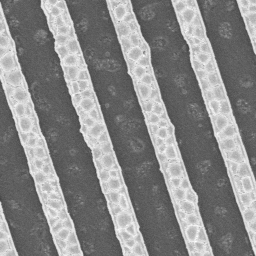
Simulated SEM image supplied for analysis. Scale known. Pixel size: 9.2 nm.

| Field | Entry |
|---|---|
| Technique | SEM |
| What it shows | one or a few lines or trenches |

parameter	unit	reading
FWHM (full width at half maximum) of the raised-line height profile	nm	203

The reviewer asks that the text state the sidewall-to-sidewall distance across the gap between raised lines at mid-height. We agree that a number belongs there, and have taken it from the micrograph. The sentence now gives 368 nm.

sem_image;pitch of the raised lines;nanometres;573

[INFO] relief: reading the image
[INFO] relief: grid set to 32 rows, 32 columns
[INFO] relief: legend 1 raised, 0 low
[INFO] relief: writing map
00000111000001110000001110000011
00000011100000111000001110000011
10000011100000111000001110000001
10000011100000111000000111000001
10000001100000011100000111000001
11000001110000011100000011000000
11000001110000011110000011100000
11000000110000001110000011100000
11000000111000001110000011100000
11100000111000001110000001110000
11100000111000000111000001110000
01110000011100000111000001110000
01110000011100000111000000111000
01110000011100000011100000111000
00111000001110000011100000111000
00111000001110000011100000011000
00111000001110000001110000011100
00011100000111000001110000011100
00011100000111000001110000011100
00011100000011000000111000001110
00001110000011100000111000001110
00001110000011100000111000000110
00001110000011100000011100000111
00000110000001110000011100000111
00000111000001110000011110000111
00000111000001110000001110000011
00000011000000111000001110000011
10000011100000111000001110000011
10000011100000111000000110000001
10000001110000011100000111000001
11000001110000011100000111000000
11000001110000011100000011000000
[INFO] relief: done